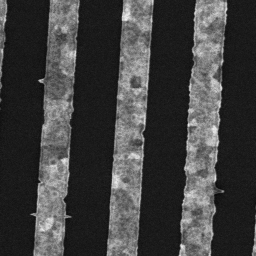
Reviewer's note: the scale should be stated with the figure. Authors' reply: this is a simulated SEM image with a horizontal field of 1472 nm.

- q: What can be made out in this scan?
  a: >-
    one or a few lines or trenches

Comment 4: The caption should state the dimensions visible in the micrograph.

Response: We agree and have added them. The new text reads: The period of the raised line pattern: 421 nanometers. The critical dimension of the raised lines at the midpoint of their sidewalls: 0.167 um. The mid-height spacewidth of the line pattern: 252 nanometres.